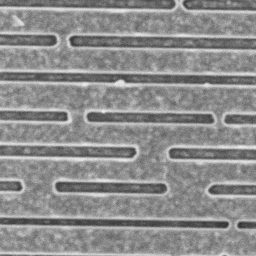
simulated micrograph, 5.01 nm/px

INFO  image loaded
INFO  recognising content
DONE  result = parallel lines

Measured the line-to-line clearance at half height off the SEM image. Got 54.5 nanometres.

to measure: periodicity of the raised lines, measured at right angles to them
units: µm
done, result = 0.183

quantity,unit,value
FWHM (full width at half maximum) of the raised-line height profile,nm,127